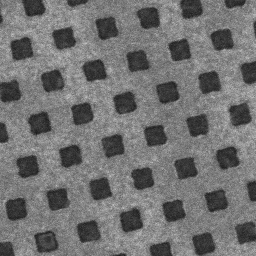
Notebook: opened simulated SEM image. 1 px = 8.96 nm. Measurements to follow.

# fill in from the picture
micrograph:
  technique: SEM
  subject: a regular array of holes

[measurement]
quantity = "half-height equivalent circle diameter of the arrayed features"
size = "212 nanometers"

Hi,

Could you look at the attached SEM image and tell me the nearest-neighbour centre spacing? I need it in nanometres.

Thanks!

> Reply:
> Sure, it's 391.